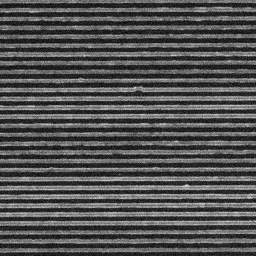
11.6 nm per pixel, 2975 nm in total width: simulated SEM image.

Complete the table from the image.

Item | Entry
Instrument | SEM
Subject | parallel lines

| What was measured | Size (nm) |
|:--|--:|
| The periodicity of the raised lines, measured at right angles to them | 103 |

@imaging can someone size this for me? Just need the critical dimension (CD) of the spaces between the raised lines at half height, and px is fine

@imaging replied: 5.38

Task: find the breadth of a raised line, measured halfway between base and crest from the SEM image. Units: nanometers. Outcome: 40.7